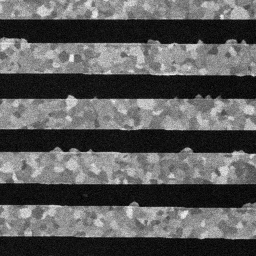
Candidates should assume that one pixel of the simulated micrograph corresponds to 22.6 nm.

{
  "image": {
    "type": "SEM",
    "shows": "lines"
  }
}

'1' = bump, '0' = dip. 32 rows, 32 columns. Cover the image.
11111111111111111111111111111111
11111111111111111111111111111111
00000000000000000000000000000000
00000000000000000000000000000000
00000000000000000000000000000000
11111111111111111100010000000000
11111111111111111111111111111111
11111111111111111111111111111111
11111111111111111111111111111111
00000000000000000000000000000000
00000000000000000000000000000000
00000000000000000000000000000000
11111111111111111111111111111111
11111111111111111111111111111111
11111111111111111111111111111111
11111111111111111111111111111111
00000000000000000000000000000000
00000000000000000000000000000000
00000000000000000000000000000000
11111111111111111111111111111111
11111111111111111111111111111111
11111111111111111111111111111111
11111111111111111111111111111111
00000000000000000000000000000000
00000000000000000000000000000000
00000000000000000000000000000000
11111111111111111111111111111111
11111111111111111111111111111111
11111111111111111111111111111111
00000000011111111111111111111111
00000000000000000000000000000000
00000000000000000000000000000000